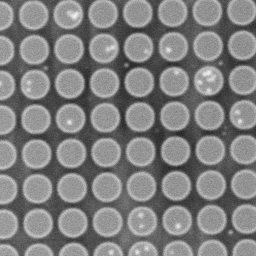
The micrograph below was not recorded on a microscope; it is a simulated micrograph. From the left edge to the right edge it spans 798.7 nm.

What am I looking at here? an array of small figures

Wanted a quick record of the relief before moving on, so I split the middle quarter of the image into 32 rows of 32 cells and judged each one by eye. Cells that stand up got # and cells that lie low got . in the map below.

................................
.........##......####....####...
####...######...######...#####..
#####..######..#######..#######.
#####..#######.#######..#######.
#####..######..#######..#######.
#####..######...######...#####..
####....####.....####.....###...
................................
................................
###......###.....####....#####..
####...######...######...######.
#####..#######..######..#######.
#####..#######..######..#######.
#####..#######..######...######.
#####..######...######...#####..
####.....###......##............
................................
..........................###...
####....#####....#####...######.
#####..#######..######...######.
#####..#######..#######..######.
#####..#######..#######..######.
#####..#######..######...######.
#####...#####....####.....####..
###......###....................
................................
..#.......#.......###.....####..
####....#####....#####...######.
#####..#######..#######..######.
#####..#######..#######..######.
#####..#######..#######..######.